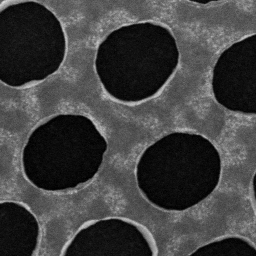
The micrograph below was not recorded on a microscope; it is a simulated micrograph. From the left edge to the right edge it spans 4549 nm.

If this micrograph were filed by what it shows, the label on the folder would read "holes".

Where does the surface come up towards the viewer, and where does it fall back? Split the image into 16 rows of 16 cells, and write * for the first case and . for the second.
...*************
....****..******
....**.....****.
....**.....***..
...***.....**...
*******...***...
**************..
***...**********
**....****...***
*......**.....**
**....***.....**
**...****.....**
*********....***
..**************
..***....*******
..**.....****...